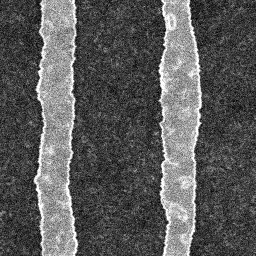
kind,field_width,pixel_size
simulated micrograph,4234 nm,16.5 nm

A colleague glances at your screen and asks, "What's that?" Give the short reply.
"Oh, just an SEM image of one or a few lines or trenches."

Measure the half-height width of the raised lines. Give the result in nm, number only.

515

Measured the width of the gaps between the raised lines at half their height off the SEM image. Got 1510 nm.